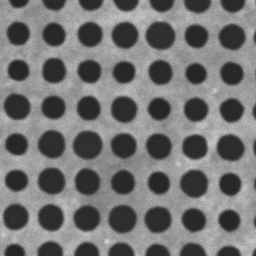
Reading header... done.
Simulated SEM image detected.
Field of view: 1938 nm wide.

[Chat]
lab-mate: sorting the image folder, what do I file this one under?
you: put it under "a regular array of holes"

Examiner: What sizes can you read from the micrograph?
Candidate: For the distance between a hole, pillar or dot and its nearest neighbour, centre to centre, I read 0.269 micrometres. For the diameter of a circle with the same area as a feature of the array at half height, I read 187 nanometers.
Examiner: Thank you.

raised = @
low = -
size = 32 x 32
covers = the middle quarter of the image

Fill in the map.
@@@@-----@@@@-----@@@------@@@@-
@@@------@@@------@@@------@@@@-
@@@@-----@@@------@@@------@@@--
@@@@-----@@@@----@@@@@-----@@@@-
@@@@@---@@@@@---@@@@@@----@@@@@-
@@@@@@@@@@@@@@@@@@@@@@@@@@@@@@@@
@@@@@@@@@@@@@@@@@@@@@@@@@@@@@@@@
@@@@@@@@@@@@@@@@@@@@@@@@@@@@@@@@
@@@@----@@@@@----@@@@@@@@@@@@@@@
@@@@-----@@@------@@@@----@@@@@-
@@@------@@@------@@@------@@@--
@@@------@@@------@@@------@@@--
@@@@-----@@@------@@@-----@@@@--
@@@@@---@@@@@-----@@@@----@@@@@-
@@@@@@@@@@@@@@--@@@@@@@@@@@@@@@@
@@@@@@@@@@@@@@@@@@@@@@@@@@@@@@@@
@@@@@@@@@@@@@@@@@@@@@@@@@@@@@@@@
@@@-----@@@@@@--@@@@@@@-@@@@@@@@
@@@------@@@-----@@@@-----@@@@@-
@@--------@@------@@@------@@@--
@@--------@@------@@@------@@@--
@@-------@@@------@@@------@@@--
@@@------@@@@----@@@@-----@@@@--
@@@@----@@@@@@--@@@@@@@--@@@@@@-
@@@@@@@@@@@@@@@@@@@@@@@@@@@@@@@@
@@@@@@@@@@@@@@@@@@@@@@@@@@@@@@@@
@@@@---@@@@@@@@@@@@@@@@@@@@@@@@-
@@@------@@@@----@@@@@---@@@@@--
@@@------@@@------@@@-----@@@---
@@@------@@@------@@@------@@---
@@@------@@@------@@@------@@---
@@@-----@@@@-----@@@@@----@@@---